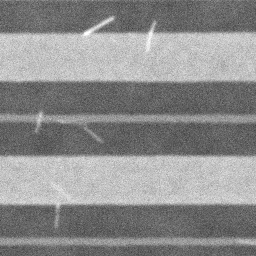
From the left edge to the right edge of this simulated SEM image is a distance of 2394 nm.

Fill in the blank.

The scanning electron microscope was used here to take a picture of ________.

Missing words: lines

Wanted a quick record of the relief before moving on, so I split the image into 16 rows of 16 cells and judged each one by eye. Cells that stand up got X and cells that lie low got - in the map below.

----------------
----------------
XXXXXXXXXXXXXXXX
XXXXXXXXXXXXXXXX
XXXXXXXXXXXXXXXX
----------------
----------------
----------------
----------------
----------------
XXXXXXXXXXXXXXXX
XXXXXXXXXXXXXXXX
XXXXXXXXXXXXXXXX
----------------
----------------
----------------